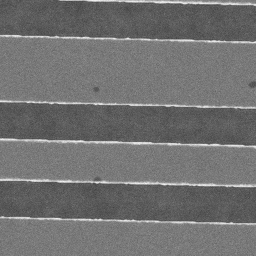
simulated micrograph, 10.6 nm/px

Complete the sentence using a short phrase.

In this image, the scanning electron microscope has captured lines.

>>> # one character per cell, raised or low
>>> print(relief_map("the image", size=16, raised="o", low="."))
................
................
oooooooooo......
oooooooooooooooo
oooooooooooooooo
oooooooooooooooo
.....ooooooooooo
................
................
oooooooooooooooo
oooooooooooooooo
..........oooooo
................
................
oooooooooooooooo
oooooooooooooooo